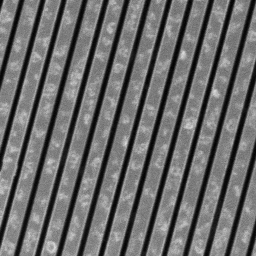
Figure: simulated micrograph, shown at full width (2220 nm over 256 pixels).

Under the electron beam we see parallel lines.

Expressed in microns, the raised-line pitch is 0.177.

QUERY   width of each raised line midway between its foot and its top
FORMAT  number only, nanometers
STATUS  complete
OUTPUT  131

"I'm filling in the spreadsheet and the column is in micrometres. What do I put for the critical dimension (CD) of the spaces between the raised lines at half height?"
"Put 0.0492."